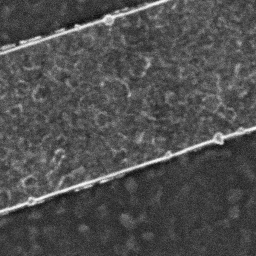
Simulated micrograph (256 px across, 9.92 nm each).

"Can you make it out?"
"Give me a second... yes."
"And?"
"one or a few lines or trenches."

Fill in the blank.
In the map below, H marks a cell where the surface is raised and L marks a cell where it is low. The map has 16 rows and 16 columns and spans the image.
LLLLLLLLLHHHHHHH
LLLLLLHHHHHHHHHH
LLLHHHHHHHHHHHHH
HHHHHHHHHHHHHHHH
HHHHHHHHHHHHHHHH
HHHHHHHHHHHHHHHH
HHHHHHHHHHHHHHHH
HHHHHHHHHHHHHHHH
HHHHHHHHHHHHHHLL
HHHHHHHHHHHLLLLL
HHHHHHHHLLLLLLLL
HHHHHLLLLLLLLLLL
HHLLLLLLLLLLLLLL
LLLLLLLLLLLLLLLL
LLLLLLLLLLLLLLLL
LLLLLLLLLLLLLLLL